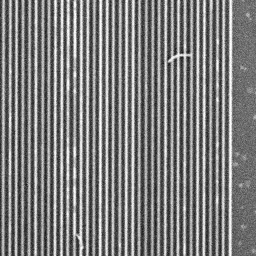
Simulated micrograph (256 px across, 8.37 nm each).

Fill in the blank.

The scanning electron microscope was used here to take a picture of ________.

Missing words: parallel lines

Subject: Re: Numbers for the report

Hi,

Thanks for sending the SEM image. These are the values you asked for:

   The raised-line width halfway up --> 1.62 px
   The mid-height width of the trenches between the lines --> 41.9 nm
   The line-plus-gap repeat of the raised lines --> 54.3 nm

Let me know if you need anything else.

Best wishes